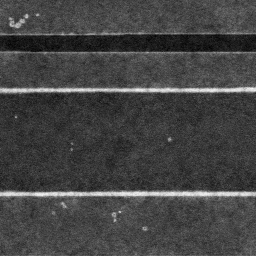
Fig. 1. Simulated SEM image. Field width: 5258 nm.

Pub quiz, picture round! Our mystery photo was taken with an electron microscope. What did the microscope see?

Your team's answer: lines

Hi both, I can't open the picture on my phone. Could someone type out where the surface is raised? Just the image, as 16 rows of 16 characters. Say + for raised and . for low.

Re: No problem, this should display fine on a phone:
++++++++++++++++
++++++++++++++++
++++++++++++++++
++++++++++++++++
++++++++++++++++
++++++++++++++++
................
................
................
................
................
................
++++++++++++++++
++++++++++++++++
++++++++++++++++
++++++++++++++++